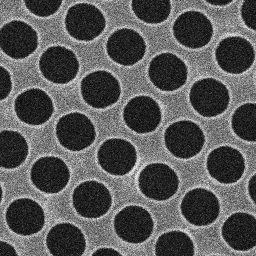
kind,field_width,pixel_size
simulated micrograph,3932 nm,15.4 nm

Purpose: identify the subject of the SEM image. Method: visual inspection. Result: a regular array of holes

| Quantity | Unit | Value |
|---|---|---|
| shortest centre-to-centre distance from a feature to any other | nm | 746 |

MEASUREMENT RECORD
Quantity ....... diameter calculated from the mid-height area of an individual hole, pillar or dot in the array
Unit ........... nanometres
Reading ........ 601